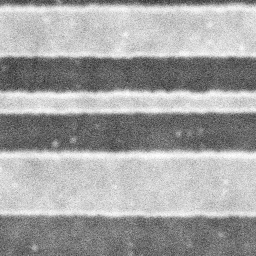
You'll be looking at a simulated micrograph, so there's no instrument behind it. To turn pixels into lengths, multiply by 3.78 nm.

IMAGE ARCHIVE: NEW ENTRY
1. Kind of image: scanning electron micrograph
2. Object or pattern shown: lines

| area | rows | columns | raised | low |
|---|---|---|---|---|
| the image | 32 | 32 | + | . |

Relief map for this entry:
................................
++++++++++++++++++++++++++++++++
++++++++++++++++++++++++++++++++
++++++++++++++++++++++++++++++++
++++++++++++++++++++++++++++++++
++++++++++++++++++++++++++++++++
++++++++++++++++++++++++++++++++
................................
................................
................................
................................
................................
++++++++++++++++++++++++++++++++
++++++++++++++++++++++++++++++++
................................
................................
................................
................................
................................
+++.++..+++.+...++.+.+.+.++++++.
++++++++++++++++++++++++++++++++
++++++++++++++++++++++++++++++++
++++++++++++++++++++++++++++++++
++++++++++++++++++++++++++++++++
++++++++++++++++++++++++++++++++
++++++++++++++++++++++++++++++++
++++++++++++++++++++++++++++++++
................................
................................
................................
................................
................................